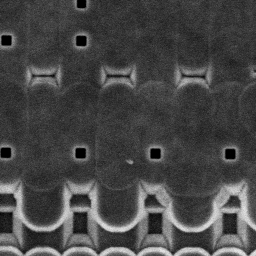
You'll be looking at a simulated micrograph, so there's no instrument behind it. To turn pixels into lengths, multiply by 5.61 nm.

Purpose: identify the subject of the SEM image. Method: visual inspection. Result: wiring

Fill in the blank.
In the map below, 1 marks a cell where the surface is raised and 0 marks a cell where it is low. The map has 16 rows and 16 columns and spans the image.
1111111111111111
1111111111111111
1111111111111111
1111111111111111
1111111111111111
1111111111111111
1111111111111111
1111111111111111
1111111111111111
1111111111111111
1111111111111111
1111111111111111
0111001110111101
0111001110011001
0000000000000000
0000000000000000